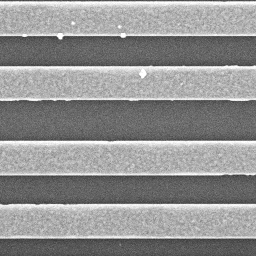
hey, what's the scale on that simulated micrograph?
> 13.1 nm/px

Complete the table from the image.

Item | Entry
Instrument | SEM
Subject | lines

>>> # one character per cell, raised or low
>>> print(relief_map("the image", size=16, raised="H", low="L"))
HHHHHHHHHHHHHHHH
HHHHHHHHHHHHHHHH
LLLLLLLLLLLLLLLL
LLLLLLLLLLLLLLLL
HHHHHHHHHHHHHHHH
HHHHHHHHHHHHHHHH
LLLLLLLLLLLLLLLL
LLLLLLLLLLLLLLLL
LLLLLLLLLLLLLLLL
HHHHHHHHHHHHHHHH
HHHHHHHHHHHHHHHH
LLLLLLLLLLLLLLLL
LLLLLLLLLLLLLLLL
HHHHHHHHHHHHHHHH
HHHHHHHHHHHHHHHH
LLLLLLLLLLLLLLLL